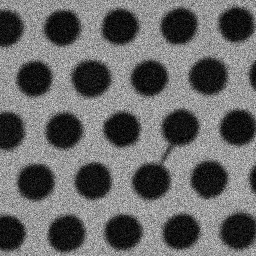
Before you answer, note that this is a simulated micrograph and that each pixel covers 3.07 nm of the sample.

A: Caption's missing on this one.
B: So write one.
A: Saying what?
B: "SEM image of a regular array of holes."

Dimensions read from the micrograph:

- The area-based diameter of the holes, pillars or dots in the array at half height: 111 nanometers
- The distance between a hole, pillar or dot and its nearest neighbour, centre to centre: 177 nm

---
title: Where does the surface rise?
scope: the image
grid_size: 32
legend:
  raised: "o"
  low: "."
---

oooooooooooooooooooooooooooooooo
..ooooo..ooooo..ooooo...oooo...o
...ooo....ooo....ooo.....oo.....
...ooo....ooo....ooo.....oo.....
...ooo....ooo....ooo....oooo...o
..ooooo..ooooo..oooooo.ooooooooo
oooooooooooooooooooooooooooooooo
ooooooooooooooooooooooooo..ooooo
ooo...oooo...oooo....ooo....ooo.
oo....ooo.....oo.....ooo....ooo.
oo....ooo.....ooo....ooo....ooo.
ooo...oooo...oooo...ooooo..ooooo
oooooooooooooooooooooooooooooooo
oooooooooooooooooooooooooooooooo
..ooooo..ooooo...oooo...oooo....
...ooo....ooo....ooo.....ooo....
...ooo....ooo....ooo.....ooo....
...ooo....oooo...oooo...oooo...o
..oooooo.oooooooooooo.oooooooooo
oooooooooooooooooooo.ooooooooooo
ooooooooooo..oooooooooooo..ooooo
ooo...oooo....ooo....ooo....ooo.
oo.....oo.....ooo....ooo....ooo.
oo.....ooo....ooo....ooo....ooo.
ooo...oooo...ooooo..ooooo..ooooo
oooooooooooooooooooooooooooooooo
oooooooooooooooooooooooooooooooo
..ooooo...oooo...oooo...oooo....
...ooo....ooo.....ooo....ooo....
...ooo.....oo.....oo.....ooo....
...ooo....oooo...oooo...oooo...o
oooooooooooooooooooooooooooooooo